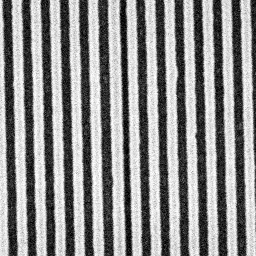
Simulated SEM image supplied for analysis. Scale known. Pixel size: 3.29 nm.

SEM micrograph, parallel lines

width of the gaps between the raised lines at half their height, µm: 0.03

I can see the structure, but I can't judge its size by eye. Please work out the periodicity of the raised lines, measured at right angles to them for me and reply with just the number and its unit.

62.6 nm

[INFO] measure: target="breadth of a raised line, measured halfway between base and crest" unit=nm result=32.8